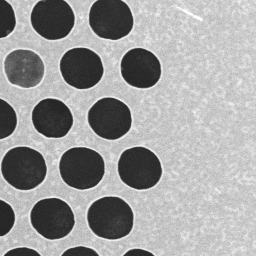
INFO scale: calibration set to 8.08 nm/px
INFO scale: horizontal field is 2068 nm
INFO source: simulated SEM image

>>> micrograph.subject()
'a regular array of holes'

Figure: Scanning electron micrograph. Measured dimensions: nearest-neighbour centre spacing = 463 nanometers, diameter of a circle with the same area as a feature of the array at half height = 347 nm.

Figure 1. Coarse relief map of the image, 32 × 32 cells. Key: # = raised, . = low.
.###....####....################
..##.....##.....################
..##.....##......###############
..##.....##......###############
.####...####....################
################################
#...####....####...#############
#....###.....##.....############
#.....##.....##.....############
#....###.....##.....############
##...####...####...#############
################################
#####..#####...#################
..##....###.....################
..##.....##.....################
..##.....##.....################
..###....###....################
################################
##..#####..#####..##############
#....###.....##.....############
......#......##.....############
......##.....##.....############
#....###.....##.....############
##..#####..######..#############
################################
.###....####....################
..##.....##......###############
..##.....##......###############
.###.....##.....################
#####...####....################
################################
#....###....####...#############